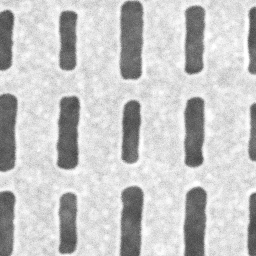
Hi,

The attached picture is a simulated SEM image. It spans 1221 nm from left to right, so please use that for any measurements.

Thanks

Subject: holes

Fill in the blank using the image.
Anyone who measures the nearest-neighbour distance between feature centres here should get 365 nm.